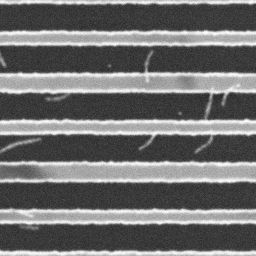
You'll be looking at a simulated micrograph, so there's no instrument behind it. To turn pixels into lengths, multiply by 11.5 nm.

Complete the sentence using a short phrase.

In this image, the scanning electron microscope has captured lines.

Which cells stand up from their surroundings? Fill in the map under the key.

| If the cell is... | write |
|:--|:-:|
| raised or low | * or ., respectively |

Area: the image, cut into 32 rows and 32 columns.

................................
................................
................................
................................
********************************
********************************
................................
................................
................................
********************************
********************************
********************************
................................
................................
................................
********************************
********************************
................................
................................
................................
********************************
********************************
********************************
................................
................................
................................
********************************
********************************
................................
................................
................................
*.**..*..*********.*.*.**.***..*